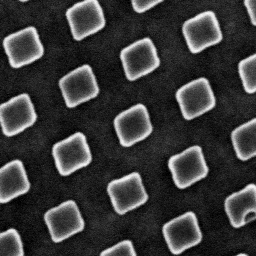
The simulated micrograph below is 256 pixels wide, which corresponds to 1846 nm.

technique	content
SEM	a regular array of raised bodies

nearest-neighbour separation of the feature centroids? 480 nanometres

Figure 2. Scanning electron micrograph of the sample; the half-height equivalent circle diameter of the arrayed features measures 262 nm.